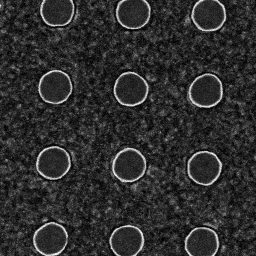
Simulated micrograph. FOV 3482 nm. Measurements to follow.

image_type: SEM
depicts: raised bodies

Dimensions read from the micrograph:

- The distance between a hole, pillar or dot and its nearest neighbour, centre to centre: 1020 nm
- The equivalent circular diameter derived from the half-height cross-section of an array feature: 446 nanometres